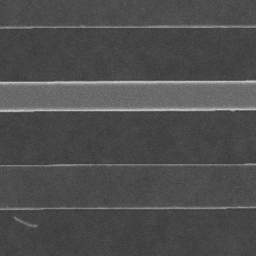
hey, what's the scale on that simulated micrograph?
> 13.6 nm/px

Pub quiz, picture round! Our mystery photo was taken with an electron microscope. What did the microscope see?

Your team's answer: lines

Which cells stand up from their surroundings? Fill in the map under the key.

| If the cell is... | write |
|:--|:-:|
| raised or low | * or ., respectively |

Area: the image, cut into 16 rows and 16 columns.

****************
****************
................
................
................
****************
****************
................
................
................
****************
****************
****************
................
................
................